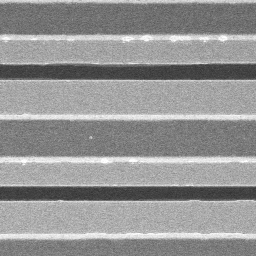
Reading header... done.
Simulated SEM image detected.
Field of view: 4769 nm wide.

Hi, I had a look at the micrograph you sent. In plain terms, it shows lines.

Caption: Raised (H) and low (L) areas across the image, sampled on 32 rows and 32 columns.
LLLLLLLLLLLLLLLLLLLLLLLLLLLLLLLL
LLLLLLLLLLLLLLLLLLLLLLLLLLLLLLLL
LLLLLLLLLLLLLLLLLLLLLLLLLLLLLLLL
LLLLLLLLLLLLLLLLLLLLLLLLLLLLLLLL
LLLLLLLLLLLLLLLLLLHLLLLLLLLLLLLL
HHHHHHHHHHHHHHHHHHHHHHHHHHHHHHHH
HHHHHHHHHHHHHHHHHHHHHHHHHHHHHHHH
HHHHHHHHHHHHHHHHHHHHHHHHHHHHHHHH
LLLLLLLLLLLLLLLLLLLLLLLLLLLLLLLL
LLLLLLLLLLLLLLLLLLLLLLLLLLLLLLLL
HHHHHHHHHHHHHHHHHHHHHHHHHHHHHHHH
HHHHHHHHHHHHHHHHHHHHHHHHHHHHHHHH
HHHHHHHHHHHHHHHHHHHHHHHHHHHHHHHH
HHHHHHHHHHHHHHHHHHHHHHHHHHHHHHHH
LLLLLLLLLLLLLLLLLLLLLLLLLLLLLLLL
LLLLLLLLLLLLLLLLLLLLLLLLLLLLLLLL
LLLLLLLLLLLLLLLLLLLLLLLLLLLLLLLL
LLLLLLLLLLLLLLLLLLLLLLLLLLLLLLLL
LLLLLLLLLLLLLLLLLLLLLLLLLLLLLLLL
LLLLLLLLLLLLLLLLLLLLLLLLLLLLLLLL
HHHHHHHHHHHHHHHHHHHHHHHHHHHHHHHH
HHHHHHHHHHHHHHHHHHHHHHHHHHHHHHHH
HHHHHHHHHHHHHHHHHHHHHHHHHHHHHHHH
LLLLLLLLLLLLLLLLLLLLLLLLLLLLLLLL
LLLLLLLLLLLLLLLLLLLLLLLLLLLLLLLL
HHHHHHHHHHHHHHHHHHHHHHHHHHHHHHHH
HHHHHHHHHHHHHHHHHHHHHHHHHHHHHHHH
HHHHHHHHHHHHHHHHHHHHHHHHHHHHHHHH
HHHHHHHHHHHHHHHHHHHHHHHHHHHHHHHH
LLLLLLLLLLLLLLLLLLLLLLLLLLLLLLLL
LLLLLLLLLLLLLLLLLLLLLLLLLLLLLLLL
LLLLLLLLLLLLLLLLLLLLLLLLLLLLLLLL